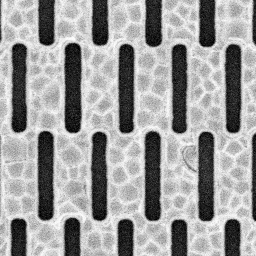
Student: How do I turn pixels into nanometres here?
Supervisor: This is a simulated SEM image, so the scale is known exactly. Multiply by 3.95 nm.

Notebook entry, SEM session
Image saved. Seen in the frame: a regular array of holes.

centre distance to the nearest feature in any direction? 0.21 um